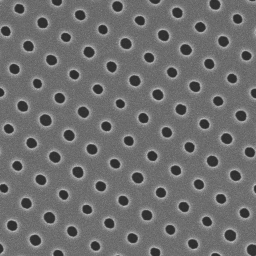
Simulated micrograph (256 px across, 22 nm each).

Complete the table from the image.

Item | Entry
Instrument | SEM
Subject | a regular array of holes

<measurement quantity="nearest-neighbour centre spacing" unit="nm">585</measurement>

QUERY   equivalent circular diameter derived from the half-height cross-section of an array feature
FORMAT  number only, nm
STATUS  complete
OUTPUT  234